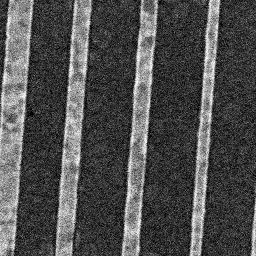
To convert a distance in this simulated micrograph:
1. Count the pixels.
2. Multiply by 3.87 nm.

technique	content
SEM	one or a few lines or trenches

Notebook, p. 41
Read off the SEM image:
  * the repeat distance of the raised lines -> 0.251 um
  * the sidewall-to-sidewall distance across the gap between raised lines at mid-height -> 197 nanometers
